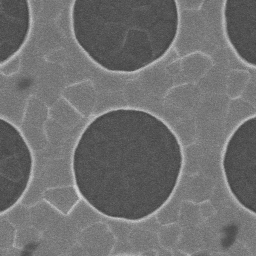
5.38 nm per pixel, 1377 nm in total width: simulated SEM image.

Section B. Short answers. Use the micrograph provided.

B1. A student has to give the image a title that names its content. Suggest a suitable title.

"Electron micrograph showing holes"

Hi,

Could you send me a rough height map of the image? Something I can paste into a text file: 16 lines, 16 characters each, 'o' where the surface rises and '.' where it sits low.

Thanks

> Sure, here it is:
..ooo......ooo..
..ooo......ooo..
..ooo......ooo..
.ooooo....ooooo.
oooooooooooooooo
oooooooooooooooo
oooooooooooooooo
oooooo....oooooo
.oooo......oooo.
..ooo......ooo..
..ooo......ooo..
..ooo......ooo..
.oooo.....ooooo.
ooooooo..ooooooo
oooooooooooooooo
oooooooooooooooo